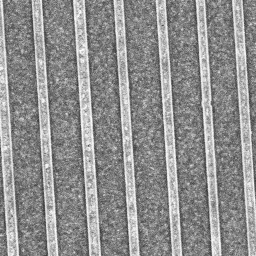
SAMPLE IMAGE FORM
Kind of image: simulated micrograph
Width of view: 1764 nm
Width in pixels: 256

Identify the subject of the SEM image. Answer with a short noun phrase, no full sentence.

parallel lines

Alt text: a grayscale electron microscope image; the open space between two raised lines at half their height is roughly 0.214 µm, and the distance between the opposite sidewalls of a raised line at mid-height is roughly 0.0679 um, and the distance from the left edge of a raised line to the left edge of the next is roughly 277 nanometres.